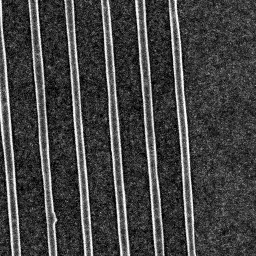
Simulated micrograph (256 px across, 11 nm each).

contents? parallel lines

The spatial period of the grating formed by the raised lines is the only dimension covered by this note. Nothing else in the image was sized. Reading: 35 px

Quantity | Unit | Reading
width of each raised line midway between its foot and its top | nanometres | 85.2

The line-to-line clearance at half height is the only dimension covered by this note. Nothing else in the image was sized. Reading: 309 nanometers